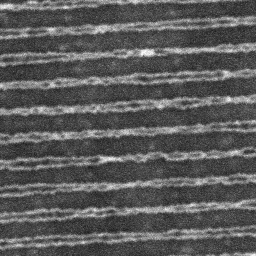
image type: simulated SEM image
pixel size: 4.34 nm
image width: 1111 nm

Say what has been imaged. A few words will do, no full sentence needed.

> parallel lines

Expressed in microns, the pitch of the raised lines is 0.114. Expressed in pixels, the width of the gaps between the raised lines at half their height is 20.8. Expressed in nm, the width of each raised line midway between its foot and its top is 24.9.